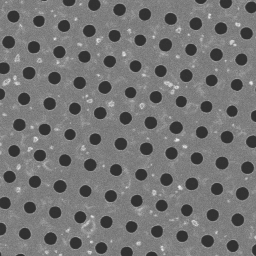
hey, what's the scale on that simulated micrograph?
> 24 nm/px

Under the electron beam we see a regular array of holes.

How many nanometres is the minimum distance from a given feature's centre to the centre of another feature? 616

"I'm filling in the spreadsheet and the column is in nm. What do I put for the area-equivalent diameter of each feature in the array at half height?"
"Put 298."